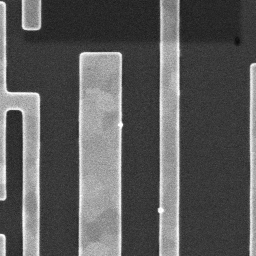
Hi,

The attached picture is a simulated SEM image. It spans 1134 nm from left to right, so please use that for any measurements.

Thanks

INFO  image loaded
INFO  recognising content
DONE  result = wiring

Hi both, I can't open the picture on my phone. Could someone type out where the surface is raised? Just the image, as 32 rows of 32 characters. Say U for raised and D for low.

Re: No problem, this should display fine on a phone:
UDDUUDDDDDDDDDDDDDDDUUDDDDDDDDDD
UDDUUDDDDDDDDDDDDDDDUUDDDDDDDDDD
UDDUUDDDDDDDDDDDDDDDUUDDDDDDDDDD
UDDUUDDDDDDDDDDDDDDDUUDDDDDDDDDD
UDDDDDDDDDDDDDDDDDDDUUDDDDDDDDDD
UDDDDDDDDDDDDDDDDDDDUUDDDDDDDDDD
UDDDDDDDDDDDDDDDDDDDUUDDDDDDDDDD
UDDDDDDDDDUUUUUDDDDDUUDDDDDDDDDD
UDDDDDDDDDUUUUUDDDDDUUDDDDDDDDDU
UDDDDDDDDDUUUUUDDDDDUUDDDDDDDDDU
UDDDDDDDDDUUUUUDDDDDUUDDDDDDDDDU
UDDDDDDDDDUUUUUDDDDDUUDDDDDDDDDU
UUUUUDDDDDUUUUUDDDDDUUDDDDDDDDDU
UUUUUDDDDDUUUUUDDDDDUUDDDDDDDDDU
UDDUUDDDDDUUUUUDDDDDUUDDDDDDDDDU
UDDUUDDDDDUUUUUDDDDDUUDDDDDDDDDU
UDDUUDDDDDUUUUUDDDDDUUDDDDDDDDDU
UDDUUDDDDDUUUUUDDDDDUUDDDDDDDDDU
UDDUUDDDDDUUUUUDDDDDUUDDDDDDDDDU
UDDUUDDDDDUUUUUDDDDDUUDDDDDDDDDU
UDDUUDDDDDUUUUUDDDDDUUDDDDDDDDDU
UDDUUDDDDDUUUUUDDDDDUUDDDDDDDDDU
UDDUUDDDDDUUUUUDDDDDUUDDDDDDDDDU
UDDUUDDDDDUUUUUDDDDDUUDDDDDDDDDU
UDDUUDDDDDUUUUUDDDDDUUDDDDDDDDDU
DDDUUDDDDDUUUUUDDDDDUUDDDDDDDDDU
DDDUUDDDDDUUUUUDDDDDUUDDDDDDDDDU
DDDUUDDDDDUUUUUDDDDDUUDDDDDDDDDU
DDDUUDDDDDUUUUUDDDDDUUDDDDDDDDDU
DDDUUDDDDDUUUUUDDDDDUUDDDDDDDDDU
UDDUUDDDDDUUUUUDDDDDUUDDDDDDDDDU
UDDUUDDDDDUUUUUDDDDDUUDDDDDDDDDU